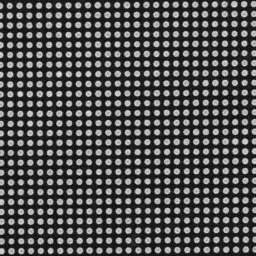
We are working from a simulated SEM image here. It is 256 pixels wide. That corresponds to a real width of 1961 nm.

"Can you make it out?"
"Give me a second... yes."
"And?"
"a regular array of raised bodies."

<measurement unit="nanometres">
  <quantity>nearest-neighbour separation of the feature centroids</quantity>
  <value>73.1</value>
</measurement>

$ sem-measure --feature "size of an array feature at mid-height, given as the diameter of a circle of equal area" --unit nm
42.3